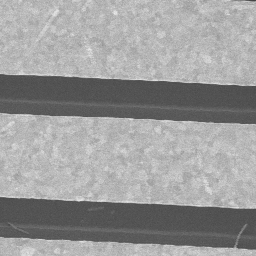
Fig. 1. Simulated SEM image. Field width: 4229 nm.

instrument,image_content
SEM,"lines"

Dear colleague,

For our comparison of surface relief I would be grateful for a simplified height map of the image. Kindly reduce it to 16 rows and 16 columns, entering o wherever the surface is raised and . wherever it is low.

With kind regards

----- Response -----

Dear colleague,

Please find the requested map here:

oooooooooooooooo
oooooooooooooooo
oooooooooooooooo
oooooooooooooooo
oooooooooooooooo
................
................
oooooooooo......
oooooooooooooooo
oooooooooooooooo
oooooooooooooooo
oooooooooooooooo
...ooooooooooooo
................
................
ooooooooooooooo.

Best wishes